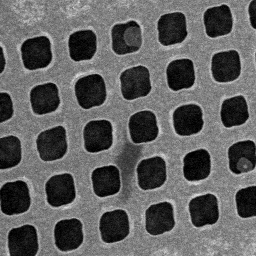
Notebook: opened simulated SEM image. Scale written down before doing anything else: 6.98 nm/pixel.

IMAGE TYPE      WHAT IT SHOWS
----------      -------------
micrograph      a regular array of holes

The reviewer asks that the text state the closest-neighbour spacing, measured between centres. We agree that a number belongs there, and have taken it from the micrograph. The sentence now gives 318 nm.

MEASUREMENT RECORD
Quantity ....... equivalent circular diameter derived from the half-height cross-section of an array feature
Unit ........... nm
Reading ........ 226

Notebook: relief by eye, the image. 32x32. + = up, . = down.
+++++++++++++++++++++++++++++++.
++++++++++++++++++++++++++...++.
++++++++++++++++++++...++....++.
++++++++++++++....++...+++...+++
+++++++++...++....++...+++.+++++
+++...+++...++....++..++++++++++
+++...+++...++...+++++++++++..++
.++...+++..+++++++++++..++....++
.++..+++++++++++..+++...++....++
+++++++++++..++....++...+++...++
++++++.++....++....++...++++++++
++++...++....++....+++++++++++++
.+++...+++...+++++++++++++++...+
..++...+++.+++++++++++...+++...+
.+++++++++++++++...+++...+++...+
+++++++++++...++....++...+++..++
+++++...++....++....++...+++++++
..+++...++....+++..+++++++++++++
...++...+++...+++++++++++++++...
...++...+++++++++++++++...+++...
..+++++++++++++++....++...+++...
++++++++++++...++....++...+++..+
++++++...++....++....++..+++++++
....++...+++...+++..+++++++++++.
....++...+++..+++++++++++..++...
....++..+++++++++++..+++...++...
...++++++++++...++....++...+++..
++++++++..++....++....++...+++++
++..+++...++....++....++++++++++
+....++...+++...++++++++++++++++
+....++...++++++++++++++++++++++
+....+++++++++++++++++++++++++++